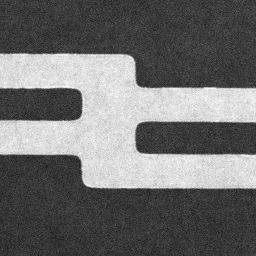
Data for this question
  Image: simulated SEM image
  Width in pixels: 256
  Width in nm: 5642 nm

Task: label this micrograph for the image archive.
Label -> groups of lines, slits or small figures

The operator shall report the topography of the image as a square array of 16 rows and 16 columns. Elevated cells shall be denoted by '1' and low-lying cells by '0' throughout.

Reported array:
0000000000000000
0000000000000000
0000000000000000
1111111100000000
1111111100000000
0000011110000000
0000011111111111
0000011111111111
1111111100000000
1111111110000000
0000011111111111
0000001111111111
0000000000000000
0000000000000000
0000000000000000
0000000000000000